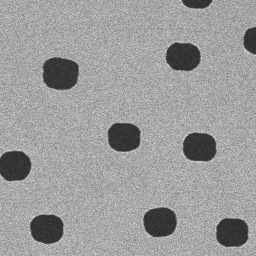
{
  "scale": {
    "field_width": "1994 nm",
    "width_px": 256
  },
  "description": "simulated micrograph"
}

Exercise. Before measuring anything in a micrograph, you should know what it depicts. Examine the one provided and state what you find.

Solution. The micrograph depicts holes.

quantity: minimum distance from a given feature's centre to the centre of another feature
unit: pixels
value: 76.2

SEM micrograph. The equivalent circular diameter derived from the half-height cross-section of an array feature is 32.2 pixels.